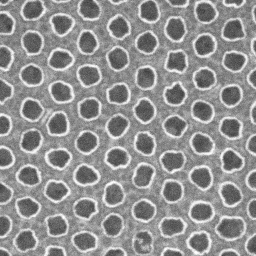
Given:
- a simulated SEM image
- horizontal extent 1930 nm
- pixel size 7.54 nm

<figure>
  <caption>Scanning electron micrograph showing a regular array of raised bodies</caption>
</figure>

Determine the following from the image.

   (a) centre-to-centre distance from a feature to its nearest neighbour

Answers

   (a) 0.238 micrometres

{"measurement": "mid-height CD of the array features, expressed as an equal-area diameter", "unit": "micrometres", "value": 0.17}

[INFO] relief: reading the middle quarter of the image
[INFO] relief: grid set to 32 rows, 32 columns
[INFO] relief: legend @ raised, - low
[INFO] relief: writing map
@---@@@@----@@@@---------@@@@@@-
---@@@@@@----@----@@@@@---@@@@--
---@@@@@@---------@@@@@---------
----@@@@@---------@@@@@---------
----@@@@@---------@@@@@---------
@----@@-----@@@@--@@@@-----@@---
@@---------@@@@@---------@@@@@--
@@---------@@@@@---------@@@@@@-
@@---------@@@@@---------@@@@@--
----@@@@@--@@@@@---@@@---@@@@@--
----@@@@@---------@@@@@---------
----@@@@@--------@@@@@@---------
----@@@@@----@----@@@@@---------
@----@@@----@@@@--@@@@----@@@---
@----------@@@@@---@@----@@@@@@-
@----------@@@@@---------@@@@@@-
@----------@@@@@---------@@@@@--
----@@@@---@@@@---@@@-----@@@@--
---@@@@@----@-----@@@@----------
---@@@@@@---------@@@@@---------
---@@@@@----------@@@@@---------
---@@@@@---@@@@---@@@@@---------
@@---@-----@@@@@----@@---@@@@@--
@@--------@@@@@@@-------@@@@@@--
@---------@@@@@@--------@@@@@@--
@---@@------@@@@--@@@@---@@@@@--
---@@@@@----------@@@@@--@@@@---
--@@@@@@@---------@@@@@--------@
--@@@@@@@--------@@@@@---------@
---@@@@@----@----@@@@@---@@@@---
@----------@@@----@@@----@@@@@--
@---------@@@@@----------@@@@@--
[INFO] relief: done